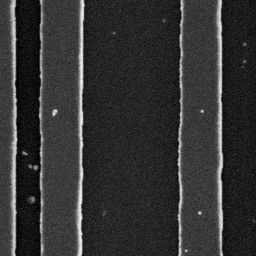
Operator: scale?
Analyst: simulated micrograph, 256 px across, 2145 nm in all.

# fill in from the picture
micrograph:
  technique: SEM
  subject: lines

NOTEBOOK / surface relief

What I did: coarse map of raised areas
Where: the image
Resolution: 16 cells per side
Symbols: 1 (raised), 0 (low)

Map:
1001100000011100
1001100000011100
1001100000011100
1001100000011100
1001100000011100
1001100000011100
1011100000011100
1011100000011100
1001100000011100
1001100000011100
1001100000011100
1001100000011100
1001100000011100
1001100000011100
1001100000011100
1001100000011100